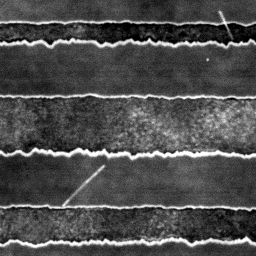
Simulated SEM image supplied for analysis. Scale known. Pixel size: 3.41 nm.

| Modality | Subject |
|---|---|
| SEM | lines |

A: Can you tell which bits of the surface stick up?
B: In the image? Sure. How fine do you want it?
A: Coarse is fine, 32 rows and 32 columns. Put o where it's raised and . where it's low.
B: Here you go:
oooooooooooooooooooooooooooooooo
oooooooooooooooooooooooooooooooo
oooooooooooooooooooooooooooooooo
................................
................................
oooooooooooooooooooooooooooooooo
oooooooooooooooooooooooooooooooo
oooooooooooooooooooooooooooooooo
oooooooooooooooooooooooooooooooo
oooooooooooooooooooooooooooooooo
oooooooooooooooooooooooooooooooo
oooooooooooooooooooooooooooooooo
................................
................................
................................
................................
................................
................................
................................
oooooooooooooooooooooooooooooooo
oooooooooooooooooooooooooooooooo
oooooooooooooooooooooooooooooooo
oooooooooooooooooooooooooooooooo
oooooooooooooooooooooooooooooooo
oooooooooooooooooooooooooooooooo
oooooooooooooooooooooooooooooooo
................................
................................
................................
................................
oooo..oooooooooooooooooooooooooo
oooooooooooooooooooooooooooooooo